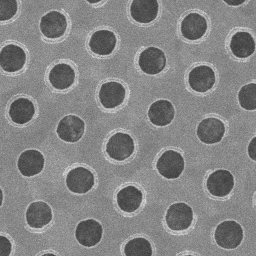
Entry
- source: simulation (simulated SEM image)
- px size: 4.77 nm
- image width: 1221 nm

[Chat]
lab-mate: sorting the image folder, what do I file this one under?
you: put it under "a regular array of holes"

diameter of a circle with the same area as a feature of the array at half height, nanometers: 132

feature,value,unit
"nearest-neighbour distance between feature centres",250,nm